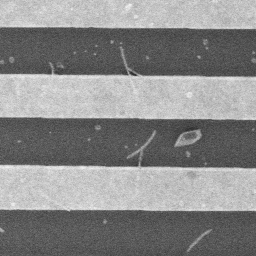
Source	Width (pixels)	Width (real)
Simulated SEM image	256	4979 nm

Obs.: lines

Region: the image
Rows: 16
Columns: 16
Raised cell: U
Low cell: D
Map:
UUUUUUUUUUUUUUUU
UUUUUUUUUUUUUUUU
DDDDDDDDDDDDDDDD
DDDDDDDDDDDDDDDD
DDDDDDDDDDDDDDDD
UUUUUUUUUUUUUUUU
UUUUUUUUUUUUUUUU
DDDDDDDDDDDDDDDD
DDDDDDDDDDDDDDDD
DDDDDDDDDDDDDDDD
UUUUUUUUUDDDDDDD
UUUUUUUUUUUUUUUU
UUUUUUUUUUUUUUUU
DDDDDDDDDDDDDDDD
DDDDDDDDDDDDDDDD
DDDDDDDDDDDDDDDD